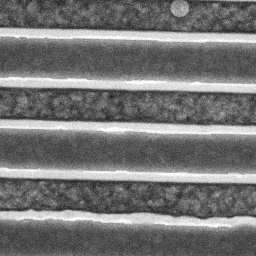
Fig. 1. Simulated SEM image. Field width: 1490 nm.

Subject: one or a few lines or trenches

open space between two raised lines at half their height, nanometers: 242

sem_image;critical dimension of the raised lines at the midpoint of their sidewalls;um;0.287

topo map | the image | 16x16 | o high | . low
................
................
oooooooooooooooo
oooooooooooooooo
oooooooooooooooo
..............oo
................
................
oooooooooooooooo
oooooooooooooooo
oooooooooooooooo
................
................
oooooo..........
oooooooooooooooo
oooooooooooooooo